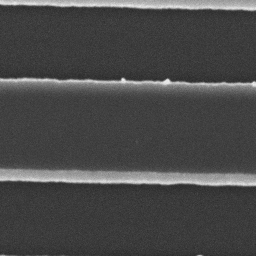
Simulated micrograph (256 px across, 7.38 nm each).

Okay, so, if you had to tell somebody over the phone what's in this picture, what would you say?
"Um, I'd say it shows lines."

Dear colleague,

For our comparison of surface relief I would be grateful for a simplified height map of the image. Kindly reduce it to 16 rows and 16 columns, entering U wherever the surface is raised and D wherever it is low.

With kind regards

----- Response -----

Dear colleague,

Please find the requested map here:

DDDDDDDDDDDDDDUU
DDDDDDDDDDDDDDDD
DDDDDDDDDDDDDDDD
DDDDDDDDDDDDDDDD
DDDDDDDDDDDDDDDD
UUUUUUUUUUUUUUUU
UUUUUUUUUUUUUUUU
UUUUUUUUUUUUUUUU
UUUUUUUUUUUUUUUU
UUUUUUUUUUUUUUUU
UUUUUUUUUUUUUUUU
DDDDDDDDDDDDDUDU
DDDDDDDDDDDDDDDD
DDDDDDDDDDDDDDDD
DDDDDDDDDDDDDDDD
DDDDDDDDDDDDDDDD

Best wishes